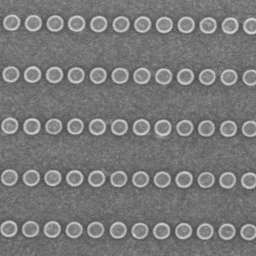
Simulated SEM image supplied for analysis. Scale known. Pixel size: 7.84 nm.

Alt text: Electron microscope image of a regular array of raised bodies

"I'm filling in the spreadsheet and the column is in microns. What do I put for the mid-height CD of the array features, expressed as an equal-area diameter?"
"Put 0.121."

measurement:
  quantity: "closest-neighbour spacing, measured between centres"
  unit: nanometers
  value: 170